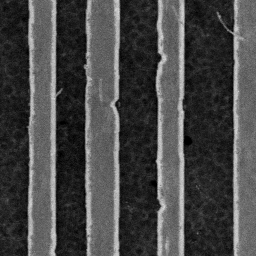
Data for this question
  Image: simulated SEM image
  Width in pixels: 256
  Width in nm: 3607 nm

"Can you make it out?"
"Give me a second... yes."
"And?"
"one or a few lines or trenches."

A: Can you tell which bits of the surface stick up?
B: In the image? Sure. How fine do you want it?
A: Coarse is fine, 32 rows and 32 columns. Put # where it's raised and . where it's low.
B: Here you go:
....###....####.....###......###
....###....####.....###.......##
....###....####.....###.......##
....###....####.....###.......##
....###....####.....###......###
....###....####.....###.......##
....###....####.....###.......##
....###....####.....###.......##
....###....####.....###.......##
....###....####.....###.......##
....###....####.....###......###
....###....####.....###......###
....###....###......###......###
....###....###......###......###
....###....####.....###......###
....###....####.....###.......##
....###....####.....###.......##
....###....####.....###.......##
....###....####.....###......###
....###....####.....###.......##
....###....####.....###......###
....###....####.....###......###
....###....####.....###.......##
....###....####.....###.......##
....###....####.....###.......##
....###....####.....###.......##
....###....####.....###.......##
....###....####.....###.......##
....###....####.....###.......##
....###....####.....###.......##
....###....####.....###.......##
....###....####.....###.......##